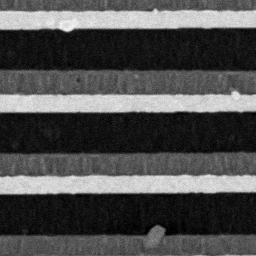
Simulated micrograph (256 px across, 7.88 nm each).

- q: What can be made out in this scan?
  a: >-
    lines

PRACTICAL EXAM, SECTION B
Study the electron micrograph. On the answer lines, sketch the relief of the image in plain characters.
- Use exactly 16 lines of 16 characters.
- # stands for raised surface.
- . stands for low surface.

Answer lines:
################
################
................
................
################
################
################
................
................
................
################
################
................
................
.........#......
################